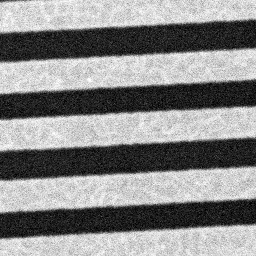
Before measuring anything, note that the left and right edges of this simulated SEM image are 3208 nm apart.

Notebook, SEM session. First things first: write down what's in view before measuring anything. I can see lines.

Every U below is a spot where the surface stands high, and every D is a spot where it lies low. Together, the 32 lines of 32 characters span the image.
UUUUUUUUUUUUUUUUUUUUUUUUUUUUUUUU
UUUUUUUUUUUUUUUUUUUUUUUUUUUUUUUU
UUUUUUUUUUUUUUUUUUUUUUUUUUUUUUDD
UUUUUUUUUUDDDDDDDDDDDDDDDDDDDDDD
DDDDDDDDDDDDDDDDDDDDDDDDDDDDDDDD
DDDDDDDDDDDDDDDDDDDDDDDDDDDDDDDD
DDDDDDDDDDDDDDDDDDDDDDDDDDDUUUUU
DDDDDDDDUUUUUUUUUUUUUUUUUUUUUUUU
UUUUUUUUUUUUUUUUUUUUUUUUUUUUUUUU
UUUUUUUUUUUUUUUUUUUUUUUUUUUUUUUU
UUUUUUUUUUUUUUUUUUUUDDDDDDDDDDDD
UUDDDDDDDDDDDDDDDDDDDDDDDDDDDDDD
DDDDDDDDDDDDDDDDDDDDDDDDDDDDDDDD
DDDDDDDDDDDDDDDDDDDDDDDDDDDDDDDU
DDDDDDDDDDDUUUUUUUUUUUUUUUUUUUUU
UUUUUUUUUUUUUUUUUUUUUUUUUUUUUUUU
UUUUUUUUUUUUUUUUUUUUUUUUUUUUUUUU
UUUUUUUUUUUUUUUUUUUUUUUDDDDDDDDD
UUUUUDDDDDDDDDDDDDDDDDDDDDDDDDDD
DDDDDDDDDDDDDDDDDDDDDDDDDDDDDDDD
DDDDDDDDDDDDDDDDDDDDDDDDDDDDDDDD
DDDDDDDDDDDDDDDDDDDDDDUUUUUUUUUU
DDDDUUUUUUUUUUUUUUUUUUUUUUUUUUUU
UUUUUUUUUUUUUUUUUUUUUUUUUUUUUUUU
UUUUUUUUUUUUUUUUUUUUUUUUUUUUUUUU
UUUUUUUUUUUUUUUUUUDDDDDDDDDDDDDD
DDDDDDDDDDDDDDDDDDDDDDDDDDDDDDDD
DDDDDDDDDDDDDDDDDDDDDDDDDDDDDDDD
DDDDDDDDDDDDDDDDDDDDDDDDDDDUUUUU
DDDDDDDDUUUUUUUUUUUUUUUUUUUUUUUU
UUUUUUUUUUUUUUUUUUUUUUUUUUUUUUUU
UUUUUUUUUUUUUUUUUUUUUUUUUUUUUUUU